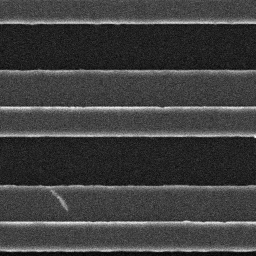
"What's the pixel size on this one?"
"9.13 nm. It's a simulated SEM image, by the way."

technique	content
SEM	lines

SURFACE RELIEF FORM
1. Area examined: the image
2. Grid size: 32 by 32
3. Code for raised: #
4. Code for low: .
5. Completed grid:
################################
################################
################################
................................
................................
................................
................................
................................
................................
################################
################################
################################
################################
################################
################################
################################
################################
................................
................................
................................
................................
................................
................................
################################
################################
################################
################################
################################
################################
################################
################################
................................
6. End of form